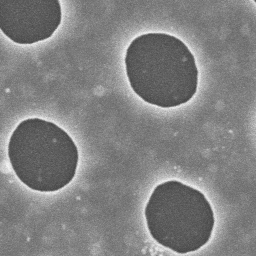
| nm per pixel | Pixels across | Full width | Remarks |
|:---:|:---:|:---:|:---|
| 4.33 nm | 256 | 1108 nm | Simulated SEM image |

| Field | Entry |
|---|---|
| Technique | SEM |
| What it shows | holes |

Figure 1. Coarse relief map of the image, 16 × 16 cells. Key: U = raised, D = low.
DDDDUUUUUUUUUUUU
DDDDUUUUUUUUUUUU
UDDUUUUUDDDUUUUU
UUUUUUUUDDDDUUUU
UUUUUUUUDDDDUUUU
UUUUUUUUDDDDUUUU
UUUUUUUUUDDUUUUU
UUDUUUUUUUUUUUUU
UDDDUUUUUUUUUUUU
UDDDDUUUUUUUUUUU
UDDDDUUUUUUUUUUU
UUDDUUUUUUDDUUUU
UUUUUUUUUDDDDUUU
UUUUUUUUUDDDDUUU
UUUUUUUUUDDDDUUU
UUUUUUUUUUDDUUUU